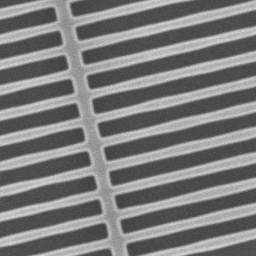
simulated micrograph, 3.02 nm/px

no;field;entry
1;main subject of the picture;groups of lines, slits or small figures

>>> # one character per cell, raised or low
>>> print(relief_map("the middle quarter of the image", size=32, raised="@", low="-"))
-@@@@@@@@@@@@@@-----------------
-@@@@@@@@@@-----------------@@@@
@@@@@@------------------@@@@@@@@
@@@@@---------------@@@@@@@@----
--@@@@----------@@@@@@@@@-------
---@@@------@@@@@@@@@-----------
---@@@@@@@@@@@@-----------------
--@@@@@@@@---------------------@
@@@@@@@@-----------------@@@@@@@
@@@@@@@--------------@@@@@@@@@--
----@@@----------@@@@@@@@@------
----@@@-------@@@@@@@-----------
----@@@@-@@@@@@@@---------------
----@@@@@@@@@------------------@
@@@@@@@@@------------------@@@@@
@@@@@@@@----------------@@@@@@@@
-----@@@------------@@@@@@@@@---
-----@@@@------@@@@@@@@---------
------@@@@@@@@@@@@--------------
-----@@@@@@@@@------------------
--@@@@@@@@@-----------------@@@@
@@@@@@@@@@--------------@@@@@@@@
@-----@@@@----------@@@@@@@@@---
-------@@@------@@@@@@@@--------
-------@@@@@@@@@@@@@@-----------
-------@@@@@@@@@----------------
---@@@@@@@@@------------------@@
@@@@@@@@@@@---------------@@@@@@
@@@-----@@@-----------@@@@@@@@@-
--------@@@------@@@@@@@@@------
--------@@@@-@@@@@@@@@----------
--------@@@@@@@@@---------------